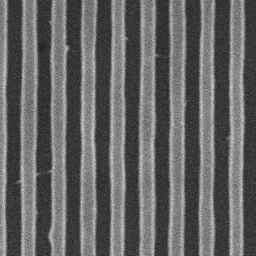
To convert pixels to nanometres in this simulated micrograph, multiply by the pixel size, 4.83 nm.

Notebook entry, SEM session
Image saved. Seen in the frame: parallel lines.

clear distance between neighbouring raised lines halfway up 82.1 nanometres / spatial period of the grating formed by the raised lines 143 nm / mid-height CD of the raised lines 0.0616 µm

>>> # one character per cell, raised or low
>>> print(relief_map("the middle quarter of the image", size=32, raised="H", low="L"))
LLLLLHHHLLLLHHHLLLLHHHLLLLLHHHLL
LLLLLHHHLLLLHHHLLLLHHHLLLLLHHHLL
LLLLLHHHLLLLHHHLLLLHHHLLLLLHHHLL
LLLLLHHHLLLLHHHLLLLHHHLLLLLHHHLL
LLLLLHHHLLLLHHHLLLLHHHLLLLLHHHLL
LLLLLHHHLLLLHHHLLLLHHHLLLLLHHHLL
LLLLLHHHLLLLHHHLLLLHHHLLLLLHHHLL
LLLLLHHHLLLLHHHLLLLHHHLLLLLHHHLL
LLLLLHHHLLLLHHHLLLLHHHLLLLLHHHLL
LLLLLHHHLLLLHHHLLLLHHHLLLLLHHHLL
LLLLLHHLLLLLHHHLLLLHHHLLLLLHHHLL
LLLLLHHLLLLLHHHLLLLHHHLLLLLHHHLL
LLLLLHHLLLLLHHHLLLLHHHHLLLLHHHLL
LLLLLHHLLLLLHHHLLLLHHHHLLLLHHHLL
LLLLLHHLLLLLHHHLLLLHHHHLLLLHHHLL
LLLLLHHLLLLLHHHLLLLHHHHLLLLHHHLL
LLLLLHHLLLLLHHHLLLLHHHLLLLLHHHLL
LLLLLHHLLLLLHHHLLLLHHHLLLLLHHHLL
LLLLLHHLLLLLHHHLLLLHHHLLLLLHHHLL
LLLLLHHLLLLLHHHLLLLHHHLLLLLHHHLL
LLLLLHHLLLLLHHHLLLLHHHLLLLLHHHLL
LLLLLHHLLLLLHHHLLLLHHHLLLLLHHHLL
LLLLLHHHLLLLHHHLLLLHHHLLLLLHHHLL
LLLLLHHHLLLLHHHLLLLHHHLLLLLHHHLL
LLLLLHHHLLLLHHHLLLLHHHLLLLLHHHLL
LLLLHHHHLLLLHHHLLLLHHHLLLLLHHHLL
LLLLHHHHLLLLHHHLLLLHHHLLLLLHHHLL
LLLLHHHHLLLLHHHLLLLHHHLLLLLHHHLL
LLLLHHHHLLLLHHHLLLLHHHLLLLLHHHLL
LLLLHHHHLLLLHHHLLLLHHHLLLLLHHHLL
LLLLHHHHLLLLHHHLLLLHHHLLLLLHHHLL
LLLLHHHHLLLLHHHLLLLHHHLLLLLHHHLL